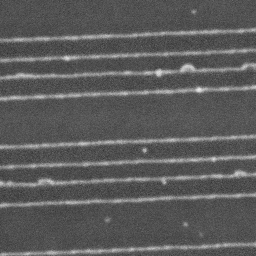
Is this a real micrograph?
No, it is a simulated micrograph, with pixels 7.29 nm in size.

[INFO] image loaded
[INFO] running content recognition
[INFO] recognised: lines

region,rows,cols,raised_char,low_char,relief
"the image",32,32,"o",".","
................................
................................
................................
................................
.............ooooooooooooooooooo
oooooooooooooooooooooooooooooooo
ooooooooooooooooooooooooooooo...
o...............................
.......................o......oo
..o.oooooooooooooooooooooooooooo
oooooooooooooooooooooooooooooooo
ooooooooooooooooooooo...........
................................
................................
................................
................................
................................
......................oooooooooo
oooooooooooooooooooooooooooooooo
oooooooooooooooooooooooooooooooo
ooooooooooo.....................
................................
.....o.......ooooooooooooooooooo
oooooooooooooooooooooooooooooooo
oooooooooooooooooooooooooooooo..
oooooo..........................
................................
................................
................................
................................
................................
.........ooooooooooooooooooooooo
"